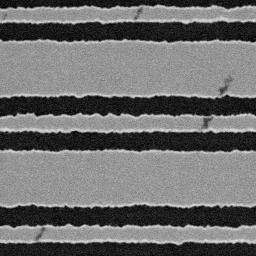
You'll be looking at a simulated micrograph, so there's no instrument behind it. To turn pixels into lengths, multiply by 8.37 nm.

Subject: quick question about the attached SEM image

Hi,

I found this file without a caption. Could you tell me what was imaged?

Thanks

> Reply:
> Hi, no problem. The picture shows lines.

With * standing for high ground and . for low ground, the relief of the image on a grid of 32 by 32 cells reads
................................
********************************
********************************
................................
................................
********************************
********************************
********************************
********************************
********************************
********************************
********************************
................................
................................
.*******************************
********************************
.....**.*...*****...............
................................
................................
********************************
********************************
********************************
********************************
********************************
********************************
********************************
................................
................................
*****************************.**
********************************
......................*.........
................................